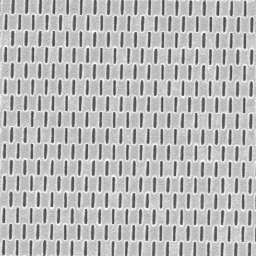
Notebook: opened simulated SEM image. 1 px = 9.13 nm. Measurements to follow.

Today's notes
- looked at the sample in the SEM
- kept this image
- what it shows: a regular array of holes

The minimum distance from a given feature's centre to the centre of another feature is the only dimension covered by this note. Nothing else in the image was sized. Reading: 123 nm